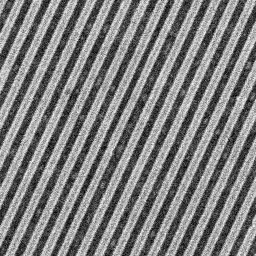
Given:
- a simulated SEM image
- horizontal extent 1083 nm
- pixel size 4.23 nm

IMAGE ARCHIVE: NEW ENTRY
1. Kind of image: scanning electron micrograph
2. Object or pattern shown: parallel lines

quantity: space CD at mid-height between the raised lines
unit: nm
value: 39.9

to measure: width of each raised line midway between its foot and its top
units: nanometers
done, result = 27.9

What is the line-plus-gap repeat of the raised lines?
0.0685 µm